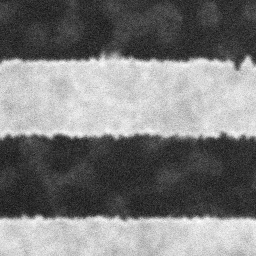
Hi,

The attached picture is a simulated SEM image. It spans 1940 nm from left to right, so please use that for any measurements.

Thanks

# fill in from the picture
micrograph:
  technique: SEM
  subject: one or a few lines or trenches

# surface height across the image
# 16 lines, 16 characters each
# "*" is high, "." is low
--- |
................
................
................
................
****************
****************
****************
****************
................
................
................
................
................
................
****************
****************